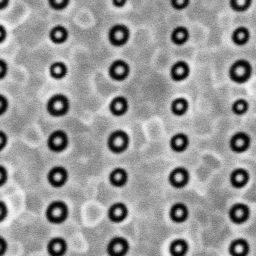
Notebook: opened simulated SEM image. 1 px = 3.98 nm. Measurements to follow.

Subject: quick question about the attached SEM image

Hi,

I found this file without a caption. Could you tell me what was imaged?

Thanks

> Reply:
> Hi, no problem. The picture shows a regular array of ring-shaped grooves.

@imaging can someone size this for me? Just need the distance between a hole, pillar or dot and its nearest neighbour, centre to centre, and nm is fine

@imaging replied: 141